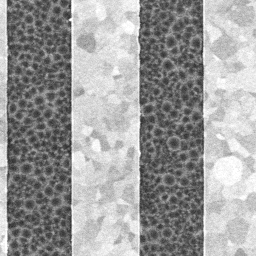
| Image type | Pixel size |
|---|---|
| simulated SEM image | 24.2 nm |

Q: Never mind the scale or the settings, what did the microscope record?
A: one or a few lines or trenches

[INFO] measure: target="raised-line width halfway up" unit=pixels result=67.3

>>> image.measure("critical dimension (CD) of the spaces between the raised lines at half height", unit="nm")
1560